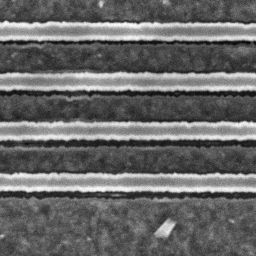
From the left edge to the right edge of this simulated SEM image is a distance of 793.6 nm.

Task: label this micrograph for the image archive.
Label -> lines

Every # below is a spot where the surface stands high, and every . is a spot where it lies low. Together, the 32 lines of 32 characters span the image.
................................
................................
................................
################################
################################
................................
................................
................................
................................
################################
################################
................................
................................
................................
................................
################################
################################
................................
................................
................................
................................
................................
################################
################################
................................
................................
................................
................................
................................
................................
................................
................................